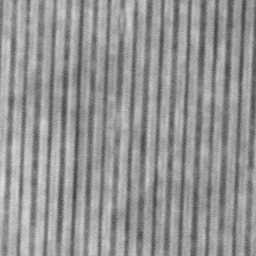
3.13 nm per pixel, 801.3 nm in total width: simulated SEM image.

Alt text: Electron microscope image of parallel lines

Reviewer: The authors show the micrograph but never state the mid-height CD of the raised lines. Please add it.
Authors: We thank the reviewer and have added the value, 0.0234 micrometres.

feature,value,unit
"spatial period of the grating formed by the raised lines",42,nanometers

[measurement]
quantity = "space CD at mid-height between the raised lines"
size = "20.3 nm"